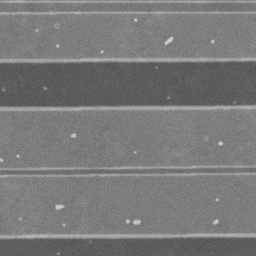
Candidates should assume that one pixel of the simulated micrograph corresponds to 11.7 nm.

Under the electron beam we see lines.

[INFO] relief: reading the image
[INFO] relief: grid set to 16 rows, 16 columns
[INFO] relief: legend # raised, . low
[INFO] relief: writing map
################
################
################
################
................
................
................
################
################
################
################
################
################
################
################
................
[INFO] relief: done